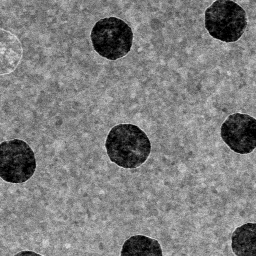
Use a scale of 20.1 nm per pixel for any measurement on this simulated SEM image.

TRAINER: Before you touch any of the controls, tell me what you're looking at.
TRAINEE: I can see holes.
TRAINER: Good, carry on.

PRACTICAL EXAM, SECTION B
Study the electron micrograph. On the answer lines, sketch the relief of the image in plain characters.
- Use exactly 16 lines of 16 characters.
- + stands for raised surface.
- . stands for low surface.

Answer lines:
+++++++++++++..+
++++++..+++++..+
.+++++..++++++.+
.+++++..++++++++
.+++++++++++++++
++++++++++++++++
++++++++++++++++
++++++++++++++..
+++++++..+++++..
..+++++..++++++.
..++++++++++++++
++++++++++++++++
++++++++++++++++
++++++++++++++++
+++++++++++++++.
++++++++..+++++.